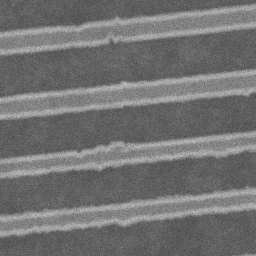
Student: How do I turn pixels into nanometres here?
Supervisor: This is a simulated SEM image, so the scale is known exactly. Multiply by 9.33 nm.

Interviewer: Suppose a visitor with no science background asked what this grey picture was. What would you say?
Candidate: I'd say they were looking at one or a few lines or trenches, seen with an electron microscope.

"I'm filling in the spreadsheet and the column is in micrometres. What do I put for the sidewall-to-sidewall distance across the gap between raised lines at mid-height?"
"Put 0.412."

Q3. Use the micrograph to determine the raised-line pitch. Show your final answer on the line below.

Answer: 0.565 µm